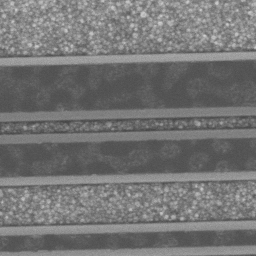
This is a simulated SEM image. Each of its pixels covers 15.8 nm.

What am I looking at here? one or a few lines or trenches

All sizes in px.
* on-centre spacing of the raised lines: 75.2